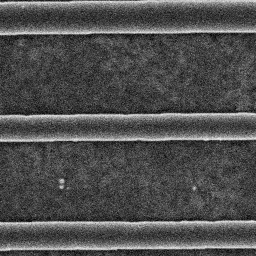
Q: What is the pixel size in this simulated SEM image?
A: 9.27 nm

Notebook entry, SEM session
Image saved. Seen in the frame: lines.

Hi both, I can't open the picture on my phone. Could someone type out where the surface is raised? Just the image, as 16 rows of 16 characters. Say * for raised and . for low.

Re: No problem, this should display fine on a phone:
****************
****************
................
................
................
................
................
****************
****************
................
................
................
................
................
****************
*************...